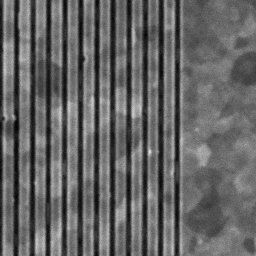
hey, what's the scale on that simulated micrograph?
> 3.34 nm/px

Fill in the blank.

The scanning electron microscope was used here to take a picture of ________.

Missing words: parallel lines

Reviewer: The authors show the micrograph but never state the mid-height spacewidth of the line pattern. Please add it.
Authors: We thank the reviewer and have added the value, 25.9 nm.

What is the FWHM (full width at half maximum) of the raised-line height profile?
29.2 nanometres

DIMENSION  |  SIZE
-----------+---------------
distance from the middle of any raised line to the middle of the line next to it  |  53.5 nanometers